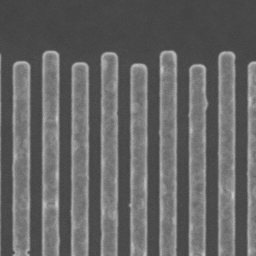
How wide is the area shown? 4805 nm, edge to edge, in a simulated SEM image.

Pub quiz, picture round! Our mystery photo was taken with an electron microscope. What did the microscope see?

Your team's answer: parallel lines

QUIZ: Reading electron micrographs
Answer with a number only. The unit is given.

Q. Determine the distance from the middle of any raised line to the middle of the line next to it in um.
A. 0.551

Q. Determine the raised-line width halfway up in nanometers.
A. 293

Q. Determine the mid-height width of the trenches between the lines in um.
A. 0.26